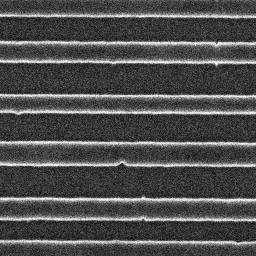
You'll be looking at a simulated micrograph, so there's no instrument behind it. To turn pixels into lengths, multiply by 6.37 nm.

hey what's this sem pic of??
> parallel lines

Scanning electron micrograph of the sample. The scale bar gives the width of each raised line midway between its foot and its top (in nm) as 128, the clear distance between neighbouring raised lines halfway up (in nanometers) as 193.